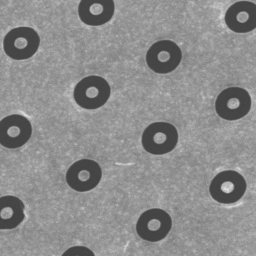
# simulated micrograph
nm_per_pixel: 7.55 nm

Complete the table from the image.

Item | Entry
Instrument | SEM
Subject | a regular array of ring-shaped grooves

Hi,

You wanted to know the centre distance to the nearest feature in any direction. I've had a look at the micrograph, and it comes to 620 nm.